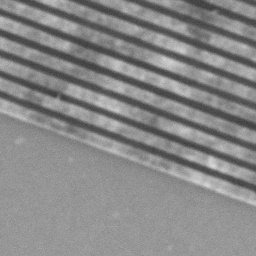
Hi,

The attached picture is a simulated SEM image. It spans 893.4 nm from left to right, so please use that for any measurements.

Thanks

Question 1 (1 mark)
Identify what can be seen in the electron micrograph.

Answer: parallel lines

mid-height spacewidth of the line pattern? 26.2 nanometers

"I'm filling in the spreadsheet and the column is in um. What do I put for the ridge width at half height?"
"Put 0.0393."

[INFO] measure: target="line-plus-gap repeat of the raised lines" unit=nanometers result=67.5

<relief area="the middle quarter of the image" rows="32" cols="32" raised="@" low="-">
@@@@-----@@@@@@@@@-----@@@@@@@@@
@@@@@@------@@@@@@@@@-----@@@@@@
@@@@@@@@@------@@@@@@@@-----@@@@
----@@@@@@@@-----@@@@@@@@@-----@
-------@@@@@@@@-----@@@@@@@@@---
@@@------@@@@@@@@------@@@@@@@@-
@@@@@@------@@@@@@@@------@@@@@@
@@@@@@@@@------@@@@@@@@-----@@@@
---@@@@@@@@@-----@@@@@@@@------@
------@@@@@@@@------@@@@@@@@----
@@@------@@@@@@@@-----@@@@@@@@@-
@@@@@@-----@@@@@@@@------@@@@@@@
@@@@@@@@@-----@@@@@@@@------@@@@
---@@@@@@@@------@@@@@@@@-----@@
-----@@@@@@@@@-----@@@@@@@@@----
@@------@@@@@@@@@-----@@@@@@@@--
@@@@@------@@@@@@@@------@@@@@@@
@@@@@@@@------@@@@@@@@------@@@@
---@@@@@@@@------@@@@@@@@-----@@
-----@@@@@@@@------@@@@@@@@@----
--------@@@@@@@@------@@@@@@@@--
-----------@@@@@@@@------@@@@@@@
-------------@@@@@@@@------@@@@@
----------------@@@@@@@@------@@
-------------------@@@@@@@@-----
---------------------@@@@@@@@@--
------------------------@@@@@@@@
---------------------------@@@@@
------------------------------@@
--------------------------------
--------------------------------
--------------------------------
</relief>